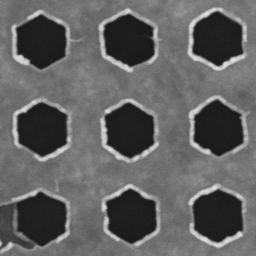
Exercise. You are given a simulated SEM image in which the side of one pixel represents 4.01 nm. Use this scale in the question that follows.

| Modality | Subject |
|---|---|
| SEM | a regular array of holes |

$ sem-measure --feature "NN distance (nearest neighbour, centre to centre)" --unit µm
0.349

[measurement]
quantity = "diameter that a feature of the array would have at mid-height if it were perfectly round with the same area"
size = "0.203 micrometres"